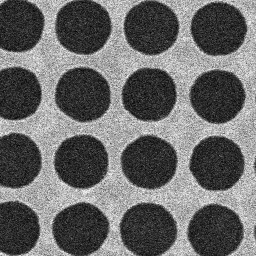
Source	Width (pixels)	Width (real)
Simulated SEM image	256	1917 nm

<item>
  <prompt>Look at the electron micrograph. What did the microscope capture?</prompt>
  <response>a regular array of holes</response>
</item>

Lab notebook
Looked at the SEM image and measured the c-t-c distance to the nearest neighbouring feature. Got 503 nm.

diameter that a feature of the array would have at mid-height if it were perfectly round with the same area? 414 nanometres